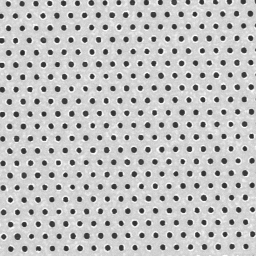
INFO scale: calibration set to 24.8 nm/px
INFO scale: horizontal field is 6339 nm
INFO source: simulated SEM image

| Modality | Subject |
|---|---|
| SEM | a regular array of holes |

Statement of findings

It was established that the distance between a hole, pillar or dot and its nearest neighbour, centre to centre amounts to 0.334 microns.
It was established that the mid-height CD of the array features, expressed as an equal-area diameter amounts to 145 nm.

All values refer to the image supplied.